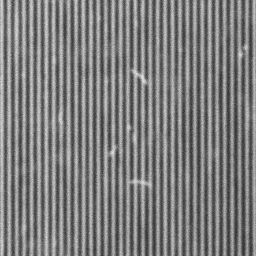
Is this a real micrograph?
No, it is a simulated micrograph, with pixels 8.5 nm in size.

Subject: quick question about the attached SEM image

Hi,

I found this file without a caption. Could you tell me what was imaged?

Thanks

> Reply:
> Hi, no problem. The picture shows parallel lines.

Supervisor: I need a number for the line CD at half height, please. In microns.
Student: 0.017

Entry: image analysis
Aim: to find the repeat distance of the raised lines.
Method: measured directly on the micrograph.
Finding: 63.1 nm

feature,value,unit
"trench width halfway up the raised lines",46.7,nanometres